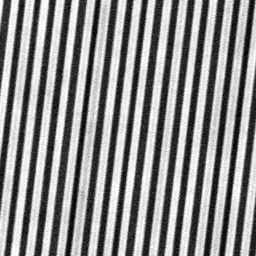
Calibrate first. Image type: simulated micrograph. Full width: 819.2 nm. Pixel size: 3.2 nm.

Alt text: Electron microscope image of parallel lines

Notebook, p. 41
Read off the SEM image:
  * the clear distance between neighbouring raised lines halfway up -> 25.8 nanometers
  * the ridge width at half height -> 7.19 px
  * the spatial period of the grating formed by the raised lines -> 48.6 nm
